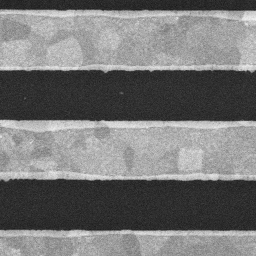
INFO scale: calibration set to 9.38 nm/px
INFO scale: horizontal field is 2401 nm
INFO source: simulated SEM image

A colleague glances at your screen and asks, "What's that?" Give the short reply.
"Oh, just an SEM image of lines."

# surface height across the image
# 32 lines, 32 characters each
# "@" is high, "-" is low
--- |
--------------------------------
--------------------------------
@@@@@@@@@@@@@@@@@@@@@@@@@@@@@@@@
@@@@@@@@@@@@@@@@@@@@@@@@@@@@@@@@
@@@@@@@@@@@@@@@@@@@@@@@@@@@@@@@@
@@@@@@@@@@@@@@@@@@@@@@@@@@@@@@@@
@@@@@@@@@@@@@@@@@@@@@@@@@@@@@@@@
@@@@@@@@@@@@@@@@@@@@@@@@@@@@@@@@
@@@@@@@@@@@-----@-@@@-----------
--------------------------------
--------------------------------
--------------------------------
--------------------------------
--------------------------------
--------------------------------
@-------------------@@---------@
@@@@@@@@@@@@@@@@@@@@@@@@@@@@@@@@
@@@@@@@@@@@@@@@@@@@@@@@@@@@@@@@@
@@@@@@@@@@@@@@@@@@@@@@@@@@@@@@@@
@@@@@@@@@@@@@@@@@@@@@@@@@@@@@@@@
@@@@@@@@@@@@@@@@@@@@@@@@@@@@@@@@
@@@@@@@@@@@@@@@@@@@@@@@@@@@@@@@@
--------------------------------
--------------------------------
--------------------------------
--------------------------------
--------------------------------
--------------------------------
--------------------------------
@@@@@@@@@@@@@@@@@@@@@@@@@@@@@@@@
@@@@@@@@@@@@@@@@@@@@@@@@@@@@@@@@
@@@@@@@@@@@@@@@@@@@@@@@@@@@@@@@@